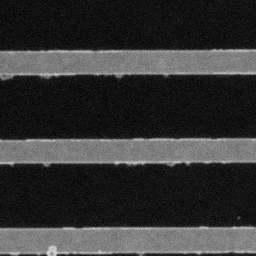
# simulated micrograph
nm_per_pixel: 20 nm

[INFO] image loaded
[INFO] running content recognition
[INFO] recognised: lines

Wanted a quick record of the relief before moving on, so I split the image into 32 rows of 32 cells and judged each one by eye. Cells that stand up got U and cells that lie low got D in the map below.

DDDDDDDDDDDDDDDDDDDDDDDDDDDDDDDD
DDDDDDDDDDDDDDDDDDDDDDDDDDDDDDDD
DDDDDDDDDDDDDDDDDDDDDDDDDDDDDDDD
DDDDDDDDDDDDDDDDDDDDDDDDDDDDDDDD
DDDDDDDDDDDDDDDDDDDDDDDDDDDDDDDD
DDDDDDDDDDDDDDDDDDDDDDDDDDDDDDDD
UUUUUUUUUUUUUUUUUUUUUUUUUUUUUUUU
UUUUUUUUUUUUUUUUUUUUUUUUUUUUUUUU
UUUUUUUUUUUUUUUUUUUUUUUUUUUUUUUU
UDDDDDDDDDDDDDDDDDDDDDDDDDDDDDDD
DDDDDDDDDDDDDDDDDDDDDDDDDDDDDDDD
DDDDDDDDDDDDDDDDDDDDDDDDDDDDDDDD
DDDDDDDDDDDDDDDDDDDDDDDDDDDDDDDD
DDDDDDDDDDDDDDDDDDDDDDDDDDDDDDDD
DDDDDDDDDDDDDDDDDDDDDDDDDDDDDDDD
DDDDDDDDDDDDDDDDDDDDDDDDDDDDDDDD
DDDDDDDDDDDDDDDDDDDDDDDDDDDDDDDD
DDDDDDDDDDDDDDDDUUUUUUUUUUUUUUUU
UUUUUUUUUUUUUUUUUUUUUUUUUUUUUUUU
UUUUUUUUUUUUUUUUUUUUUUUUUUUUUUUU
DDDDDDDDDDDDDDDDDDDDDDDDDDDDDDDD
DDDDDDDDDDDDDDDDDDDDDDDDDDDDDDDD
DDDDDDDDDDDDDDDDDDDDDDDDDDDDDDDD
DDDDDDDDDDDDDDDDDDDDDDDDDDDDDDDD
DDDDDDDDDDDDDDDDDDDDDDDDDDDDDDDD
DDDDDDDDDDDDDDDDDDDDDDDDDDDDDDDD
DDDDDDDDDDDDDDDDDDDDDDDDDDDDDDDD
DDDDDDDDDDDDDDDDDDDDDDDDDDDDDDDD
DDDDDDDDDDDDDDDDDDDDDDDDDUDDDUUU
UUUUUUUUUUUUUUUUUUUUUUUUUUUUUUUU
UUUUUUUUUUUUUUUUUUUUUUUUUUUUUUUU
UUUUUUUUUUUUUUUUUUUUUUUUUUUUUUUU